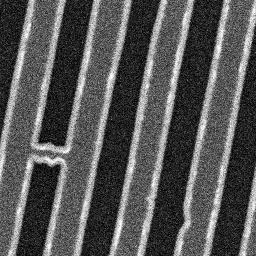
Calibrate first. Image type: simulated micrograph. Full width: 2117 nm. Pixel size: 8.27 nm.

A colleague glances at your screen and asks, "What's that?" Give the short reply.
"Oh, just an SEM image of one or a few lines or trenches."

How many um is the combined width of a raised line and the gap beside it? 0.529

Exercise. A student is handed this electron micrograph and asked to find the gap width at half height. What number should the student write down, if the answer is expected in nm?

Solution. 268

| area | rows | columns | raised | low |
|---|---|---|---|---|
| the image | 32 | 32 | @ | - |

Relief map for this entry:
----@@@@----@@@@----@@@@----@@@@
----@@@@----@@@@----@@@@----@@@@
---@@@@-----@@@@----@@@-----@@@@
---@@@@----@@@@@----@@@-----@@@@
---@@@@----@@@@----@@@@----@@@@-
---@@@@----@@@@----@@@@----@@@@-
---@@@@----@@@@----@@@@----@@@@-
--@@@@-----@@@@----@@@-----@@@@-
--@@@@----@@@@----@@@@-----@@@@-
--@@@@----@@@@----@@@@----@@@@--
--@@@@----@@@@----@@@@----@@@@--
--@@@@----@@@@----@@@@----@@@@--
-@@@@-----@@@@----@@@-----@@@@--
-@@@@----@@@@-----@@@-----@@@@--
-@@@@----@@@@----@@@@----@@@@---
-@@@@----@@@@----@@@@----@@@@---
-@@@@----@@@@----@@@@----@@@@---
@@@@-----@@@@----@@@-----@@@@---
@@@@@@@-@@@@-----@@@-----@@@@---
@@@@@@@@@@@@----@@@@----@@@@----
@@@@----@@@@----@@@@----@@@@----
@@@@----@@@@----@@@@----@@@@----
@@@-----@@@@----@@@@----@@@@----
@@@----@@@@-----@@@-----@@@@----
@@@----@@@@-----@@@----@@@@-----
@@@----@@@@----@@@@----@@@@----@
@@@----@@@@----@@@@----@@@@----@
@@----@@@@@----@@@@----@@@@----@
@@----@@@@-----@@@-----@@@@----@
@@----@@@@----@@@@----@@@@-----@
@@----@@@@----@@@@----@@@@----@@
@@----@@@@----@@@@----@@@@----@@